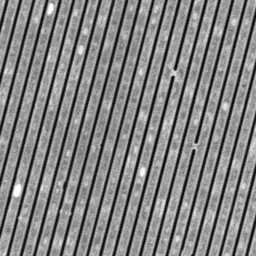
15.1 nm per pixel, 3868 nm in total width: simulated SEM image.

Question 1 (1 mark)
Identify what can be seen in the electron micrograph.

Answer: parallel lines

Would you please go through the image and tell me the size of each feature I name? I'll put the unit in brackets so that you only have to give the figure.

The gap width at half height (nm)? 58.5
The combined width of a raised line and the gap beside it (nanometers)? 194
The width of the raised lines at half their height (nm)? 135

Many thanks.